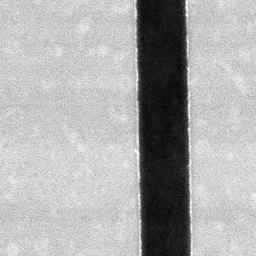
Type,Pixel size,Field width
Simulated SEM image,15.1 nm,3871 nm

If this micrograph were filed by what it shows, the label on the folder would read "one or a few lines or trenches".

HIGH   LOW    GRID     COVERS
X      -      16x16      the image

--------XXXX----
--------XXXX----
--------XXXX----
---------XXX----
---------XXX----
---------XXX----
---------XXX----
---------XXX----
---------XXX----
---------XXX----
---------XXX----
---------XXX----
---------XXX----
---------XXX----
---------XXX----
---------XXX----